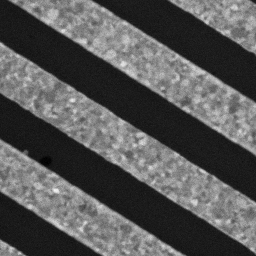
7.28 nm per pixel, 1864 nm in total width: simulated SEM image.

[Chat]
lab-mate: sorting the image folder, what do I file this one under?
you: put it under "lines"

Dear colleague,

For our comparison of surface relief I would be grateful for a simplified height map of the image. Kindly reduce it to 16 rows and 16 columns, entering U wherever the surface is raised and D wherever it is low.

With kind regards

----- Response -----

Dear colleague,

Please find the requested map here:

DUUUUUUDDDDUUUUU
DDDUUUUUDDDDDUUU
DDDDDUUUUUDDDDDU
UDDDDDUUUUUDDDDD
UUUDDDDDUUUUUDDD
UUUUUDDDDUUUUUDD
DUUUUUDDDDDUUUUU
DDDUUUUUDDDDUUUU
DDDDUUUUUDDDDDUU
UDDDDDUUUUUDDDDD
UUUDDDDDUUUUDDDD
UUUUDDDDDUUUUUDD
DUUUUUDDDDDUUUUU
DDDUUUUUDDDDUUUU
DDDDUUUUUDDDDDUU
UDDDDDUUUUUDDDDD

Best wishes